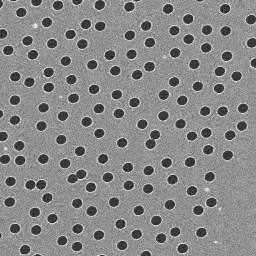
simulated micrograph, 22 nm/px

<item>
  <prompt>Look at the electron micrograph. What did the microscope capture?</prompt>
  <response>a regular array of holes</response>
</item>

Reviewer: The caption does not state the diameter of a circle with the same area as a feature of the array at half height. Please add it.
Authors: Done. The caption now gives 9.64 px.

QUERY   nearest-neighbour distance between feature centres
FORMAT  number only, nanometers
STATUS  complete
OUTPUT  400